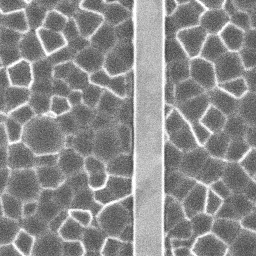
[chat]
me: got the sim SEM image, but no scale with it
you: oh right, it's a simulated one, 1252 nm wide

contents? one or a few lines or trenches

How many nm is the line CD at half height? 144